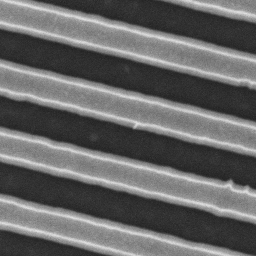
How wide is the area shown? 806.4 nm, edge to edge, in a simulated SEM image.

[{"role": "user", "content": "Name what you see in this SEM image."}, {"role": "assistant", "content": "one or a few lines or trenches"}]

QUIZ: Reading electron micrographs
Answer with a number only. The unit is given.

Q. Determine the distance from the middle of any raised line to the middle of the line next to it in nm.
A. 205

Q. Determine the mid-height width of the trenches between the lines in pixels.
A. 37.5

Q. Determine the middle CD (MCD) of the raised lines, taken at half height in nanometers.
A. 85.7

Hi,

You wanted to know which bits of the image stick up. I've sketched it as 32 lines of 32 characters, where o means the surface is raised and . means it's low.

oooo....................oooooooo
oooooooo....................oooo
oooooooooooo....................
..oooooooooooooo................
......oooooooooooooo............
..........ooooooooooooooo.......
..............oooooooooooooo....
..................oooooooooooooo
oo....................oooooooooo
ooooooo...................oooooo
ooooooooooo....................o
ooooooooooooooo.................
.....oooooooooooooo.............
.........oooooooooooooo.........
.............oooooooooooooo.....
................ooooooooooooooo.
o....................ooooooooooo
ooooo....................ooooooo
ooooooooo....................ooo
oooooooooooo....................
...oooooooooooooo...............
.......oooooooooooooo...........
...........oooooooooooooo.......
................ooooooooooooo...
....................oooooooooooo
ooo.....................oooooooo
ooooooo....................ooooo
ooooooooooo.....................
..ooooooooooooo.................
......oooooooooooooo............
..........ooooooooooooo.........
..............oooooooooooooo....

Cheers